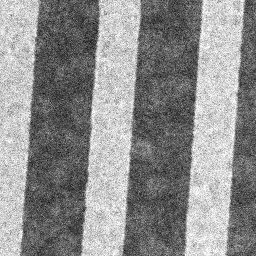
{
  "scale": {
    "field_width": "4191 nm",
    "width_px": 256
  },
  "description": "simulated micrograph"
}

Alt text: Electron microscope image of one or a few lines or trenches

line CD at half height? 649 nm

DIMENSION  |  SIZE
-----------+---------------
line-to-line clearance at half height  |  1030 nm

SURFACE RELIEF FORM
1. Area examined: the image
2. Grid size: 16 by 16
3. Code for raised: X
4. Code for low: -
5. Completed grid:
XX----XXX----XX-
XX----XXX----XX-
XX----XXX----XX-
XX----XXX---XXX-
XX----XX----XXX-
XX----XX----XXX-
XX----XX----XXX-
XX----XX----XXX-
XX----XX----XXX-
XX----XX----XXX-
XX----XX----XX--
XX---XXX----XX--
X----XXX----XX--
X----XXX----XX--
X----XXX----XX--
X----XXX----XX--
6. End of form